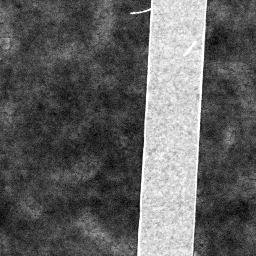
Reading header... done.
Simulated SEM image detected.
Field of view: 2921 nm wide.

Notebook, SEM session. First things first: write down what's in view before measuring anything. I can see one or a few lines or trenches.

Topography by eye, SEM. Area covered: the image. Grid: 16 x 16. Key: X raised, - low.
---------XXXX---
---------XXXX---
---------XXXX---
---------XXXX---
---------XXXX---
---------XXXX---
---------XXXX---
---------XXX----
---------XXX----
---------XXX----
---------XXX----
---------XXX----
---------XXX----
---------XXX----
---------XXX----
---------XXX----